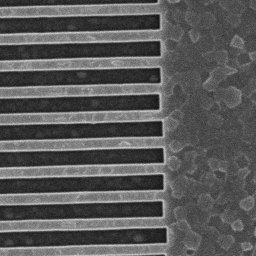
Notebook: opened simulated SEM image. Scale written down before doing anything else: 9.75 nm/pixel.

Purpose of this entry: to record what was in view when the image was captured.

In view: parallel lines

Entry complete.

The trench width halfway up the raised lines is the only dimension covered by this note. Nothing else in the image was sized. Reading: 0.155 um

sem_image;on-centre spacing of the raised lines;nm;260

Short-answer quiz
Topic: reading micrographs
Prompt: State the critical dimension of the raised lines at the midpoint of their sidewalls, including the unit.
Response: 10.2 px